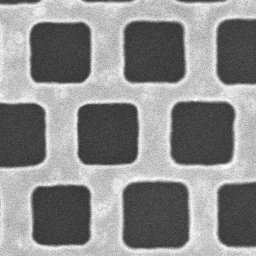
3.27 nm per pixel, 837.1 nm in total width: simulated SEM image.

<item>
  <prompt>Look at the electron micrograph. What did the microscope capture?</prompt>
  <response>holes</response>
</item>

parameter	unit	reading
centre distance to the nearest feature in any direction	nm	307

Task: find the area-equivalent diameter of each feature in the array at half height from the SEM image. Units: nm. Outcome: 224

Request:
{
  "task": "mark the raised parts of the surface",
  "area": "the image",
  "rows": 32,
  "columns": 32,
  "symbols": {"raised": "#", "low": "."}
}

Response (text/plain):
...#############################
################################
############################....
####.......#####.......####.....
####.......####........####.....
####.......####........####.....
####.......####........####.....
####.......####........####.....
####.......####........####.....
####.......#####.......####.....
############################....
################################
################################
.....#####.......#####.......###
......####.......####........###
......####.......####........###
......####.......####........###
......####.......####........###
......####.......####........###
......####.......####........###
.....######.....######......####
################################
################################
####.......#####.......####.....
####.......####.........###.....
####.......####.........###.....
####.......####.........###.....
####.......####.........###.....
####.......####.........###.....
####.......####.........###.....
#####......#####.......#####....
################################